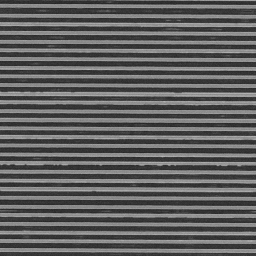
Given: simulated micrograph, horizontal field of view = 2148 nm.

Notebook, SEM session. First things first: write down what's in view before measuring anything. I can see parallel lines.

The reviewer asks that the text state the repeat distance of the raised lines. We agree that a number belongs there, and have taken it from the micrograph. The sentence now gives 73.2 nanometres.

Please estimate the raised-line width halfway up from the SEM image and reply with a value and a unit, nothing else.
0.0304 micrometres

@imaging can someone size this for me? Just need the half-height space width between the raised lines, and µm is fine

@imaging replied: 0.0451